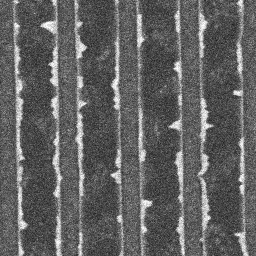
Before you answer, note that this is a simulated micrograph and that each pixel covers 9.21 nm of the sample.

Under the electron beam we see parallel lines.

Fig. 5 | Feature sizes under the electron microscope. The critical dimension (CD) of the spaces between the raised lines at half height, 180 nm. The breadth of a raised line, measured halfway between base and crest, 42.5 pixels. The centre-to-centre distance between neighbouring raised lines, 0.566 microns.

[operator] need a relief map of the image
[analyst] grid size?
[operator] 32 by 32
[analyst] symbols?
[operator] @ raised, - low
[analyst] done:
--@@@@@--@@@@@@--@@@@@---@@@@@--
--@@@@@--@@@@@@--@@@@@---@@@@@--
--@@@@@--@@@@@@--@@@@@---@@@@@--
--@@@@@--@@@@@@--@@@@@---@@@@@--
--@@@@@--@@@@@@--@@@@@---@@@@@--
--@@@@@--@@@@@@--@@@@@---@@@@@--
--@@@@@---@@@@@--@@@@@---@@@@@--
--@@@@@---@@@@@--@@@@@@--@@@@@--
--@@@@@---@@@@@--@@@@@@--@@@@@--
--@@@@@---@@@@@--@@@@@@--@@@@@--
--@@@@@---@@@@@--@@@@@@--@@@@@--
--@@@@@---@@@@@--@@@@@@--@@@@@--
--@@@@@---@@@@@--@@@@@@--@@@@@--
--@@@@@---@@@@@--@@@@@@--@@@@@--
--@@@@@---@@@@@--@@@@@@--@@@@@--
--@@@@@---@@@@@--@@@@@@--@@@@@--
--@@@@@---@@@@@--@@@@@@--@@@@@--
--@@@@@---@@@@@--@@@@@@--@@@@@--
--@@@@@---@@@@@--@@@@@@--@@@@@--
--@@@@@---@@@@@--@@@@@@--@@@@@--
--@@@@@---@@@@@---@@@@@--@@@@@--
--@@@@@---@@@@@---@@@@@--@@@@@--
--@@@@@@--@@@@@---@@@@@--@@@@@--
--@@@@@---@@@@@---@@@@@--@@@@@--
--@@@@@---@@@@@---@@@@@--@@@@@--
--@@@@@---@@@@@---@@@@@--@@@@@--
--@@@@@---@@@@@---@@@@@--@@@@@--
--@@@@@---@@@@@---@@@@@--@@@@@@-
--@@@@@@--@@@@@---@@@@@--@@@@@@-
--@@@@@@--@@@@@---@@@@@--@@@@@@-
--@@@@@@--@@@@@---@@@@@--@@@@@@-
--@@@@@@--@@@@@---@@@@@--@@@@@@-